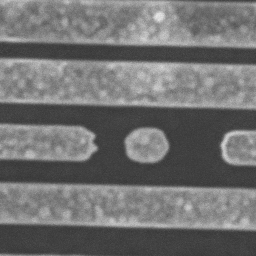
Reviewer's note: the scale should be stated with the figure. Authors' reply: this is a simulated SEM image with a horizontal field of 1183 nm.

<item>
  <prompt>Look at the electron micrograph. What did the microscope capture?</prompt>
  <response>one or a few lines or trenches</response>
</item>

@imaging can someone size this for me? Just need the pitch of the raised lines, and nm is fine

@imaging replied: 283